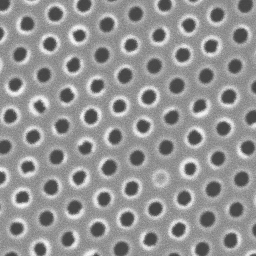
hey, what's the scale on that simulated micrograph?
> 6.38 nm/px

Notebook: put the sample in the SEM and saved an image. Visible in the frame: a regular array of holes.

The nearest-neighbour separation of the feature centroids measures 0.191 um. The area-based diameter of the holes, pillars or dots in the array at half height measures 94.5 nanometres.